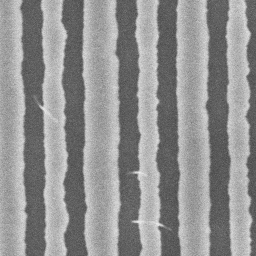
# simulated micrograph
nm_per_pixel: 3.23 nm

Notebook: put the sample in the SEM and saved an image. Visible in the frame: lines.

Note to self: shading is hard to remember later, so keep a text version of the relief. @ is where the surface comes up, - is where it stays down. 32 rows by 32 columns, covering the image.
@@@--@@@---@@@---@@@--@@@@---@@-
@@@--@@@--@@@@---@@@--@@@@---@@-
@@@--@@@--@@@@---@@@--@@@@---@@-
@@@--@@@--@@@@@--@@@--@@@@--@@@-
@@@--@@@--@@@@@--@@@--@@@@--@@@-
@@@--@@@--@@@@---@@@--@@@@--@@@-
@@@--@@@--@@@@---@@@--@@@@--@@@-
@@@---@@--@@@@@--@@@--@@@@--@@@-
@@@---@@--@@@@@--@@@--@@@@--@@@-
@@@---@@--@@@@@--@@@--@@@@---@@-
@@@--@@@---@@@@--@@@--@@@@---@@-
@@@--@@@---@@@@--@@@--@@@@--@@@-
@@@--@@@---@@@@--@@@--@@@@--@@@-
@@@--@@@---@@@@--@@@--@@@@---@@-
@@@---@@---@@@@--@@@--@@@@---@@-
@@@---@@---@@@@--@@@--@@@@--@@@-
@@@---@@---@@@@---@@--@@@@--@@@-
@@@---@@---@@@@---@@--@@@@---@@-
@@@---@@---@@@@--@@@--@@@@---@@-
@@@---@@--@@@@@--@@@--@@@@---@@-
@@@---@@--@@@@@---@@--@@@@---@@-
@@@---@@--@@@@@--@@@---@@@---@@-
@@@---@@---@@@@--@@@--@@@@---@@-
@@@---@@---@@@@---@@--@@@@---@@-
@@@---@@---@@@@---@@--@@@@---@@-
@@@---@@---@@@@---@@--@@@@---@@-
@@@---@@---@@@@--@@@--@@@@---@@-
@@@---@@@--@@@@--@@@--@@@@---@@-
@@@---@@---@@@@--@@@--@@@@---@@-
@@@---@@---@@@@---@@--@@@@---@@-
@@@---@@---@@@@---@@---@@@---@@-
@@@---@@---@@@@---@@---@@@---@@-